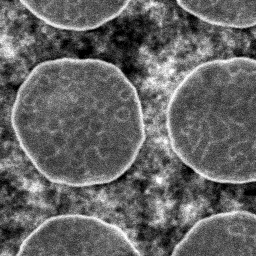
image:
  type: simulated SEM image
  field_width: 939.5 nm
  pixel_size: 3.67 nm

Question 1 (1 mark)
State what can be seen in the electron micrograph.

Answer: raised bodies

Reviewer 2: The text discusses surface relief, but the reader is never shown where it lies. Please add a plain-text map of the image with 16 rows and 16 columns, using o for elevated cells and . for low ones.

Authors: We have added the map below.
..oooooo....oooo
...ooo........oo
................
................
..ooooo.....oooo
.ooooooo...ooooo
.oooooooo..ooooo
.oooooooo..ooooo
.oooooooo..ooooo
..ooooooo..ooooo
..oooooo....oooo
................
................
..............oo
..oooooo....oooo
.ooooooo...ooooo